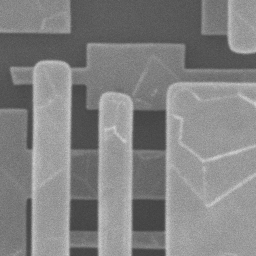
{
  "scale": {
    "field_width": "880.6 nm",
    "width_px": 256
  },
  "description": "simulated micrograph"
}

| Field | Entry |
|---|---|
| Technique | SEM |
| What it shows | wiring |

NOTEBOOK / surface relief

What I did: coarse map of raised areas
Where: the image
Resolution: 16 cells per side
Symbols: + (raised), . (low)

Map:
..............++
..............++
..............++
................
..++............
..++.......+++++
..++..++..++++++
..++..++..++++++
..++..++..++++++
..++..++..++++++
..++..++..++++++
..++..++..++++++
..++..++..++++++
..++..++..++++++
..++..++..++++++
..++..++..++++++